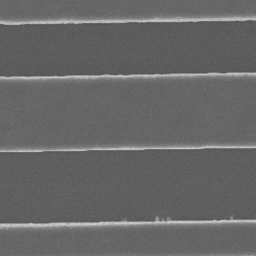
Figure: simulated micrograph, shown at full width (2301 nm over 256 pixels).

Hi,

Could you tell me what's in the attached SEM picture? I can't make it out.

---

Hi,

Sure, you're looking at lines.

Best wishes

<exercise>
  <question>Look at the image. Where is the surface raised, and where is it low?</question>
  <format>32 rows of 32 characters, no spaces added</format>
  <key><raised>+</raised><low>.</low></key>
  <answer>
++++++++++++++++++++++++++++++++
++++++++++++++++++++++++++++++++
++++++++++++++++++++++++++++++..
................................
................................
................................
................................
................................
................................
............+++.++++++++++++++++
++++++++++++++++++++++++++++++++
++++++++++++++++++++++++++++++++
++++++++++++++++++++++++++++++++
++++++++++++++++++++++++++++++++
++++++++++++++++++++++++++++++++
++++++++++++++++++++++++++++++++
++++++++++++++++++++++++++++++++
++++++++++++++++++++++++++++++++
++++++++++++++++++++++++++......
................................
................................
................................
................................
................................
................................
................................
................................
................................
++++++++++++++++++++++++++++++++
++++++++++++++++++++++++++++++++
++++++++++++++++++++++++++++++++
++++++++++++++++++++++++++++++++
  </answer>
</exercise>